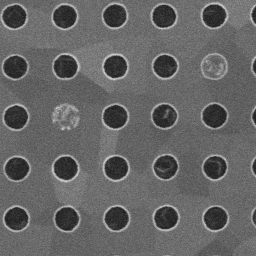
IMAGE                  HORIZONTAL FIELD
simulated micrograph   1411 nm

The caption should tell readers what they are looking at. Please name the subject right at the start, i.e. a regular array of holes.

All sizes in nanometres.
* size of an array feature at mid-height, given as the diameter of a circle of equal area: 136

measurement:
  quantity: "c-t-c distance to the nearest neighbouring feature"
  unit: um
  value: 0.273